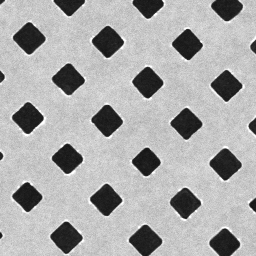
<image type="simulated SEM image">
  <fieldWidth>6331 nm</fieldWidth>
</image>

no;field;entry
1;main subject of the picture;a regular array of holes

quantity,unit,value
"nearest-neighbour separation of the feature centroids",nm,1360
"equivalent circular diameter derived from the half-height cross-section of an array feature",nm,693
